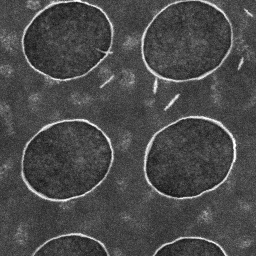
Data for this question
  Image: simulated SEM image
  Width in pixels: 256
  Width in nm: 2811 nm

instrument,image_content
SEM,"holes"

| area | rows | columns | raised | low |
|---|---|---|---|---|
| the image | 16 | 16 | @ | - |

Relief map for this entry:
@@@---@@@@---@@@
@@-----@@-----@@
@------@@-----@@
@@----@@@-----@@
@@@--@@@@@---@@@
@@@@@@@@@@@@@@@@
@@@@@@@@@@@@@@@@
@@@@@@@@@@@--@@@
@@-----@@@----@@
@@-----@@------@
@------@@-----@@
@@----@@@-----@@
@@@@@@@@@@@@@@@@
@@@@@@@@@@@@@@@@
@@@@@@@@@@@@@@@@
@@@---@@@@----@@